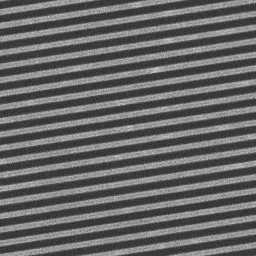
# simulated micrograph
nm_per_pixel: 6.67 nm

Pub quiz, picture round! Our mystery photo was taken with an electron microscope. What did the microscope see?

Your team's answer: parallel lines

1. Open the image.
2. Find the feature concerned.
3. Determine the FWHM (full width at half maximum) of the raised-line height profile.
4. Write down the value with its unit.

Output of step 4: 44.5 nm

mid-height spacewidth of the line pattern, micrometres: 0.0445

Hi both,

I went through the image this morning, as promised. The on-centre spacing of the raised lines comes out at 89.7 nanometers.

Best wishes